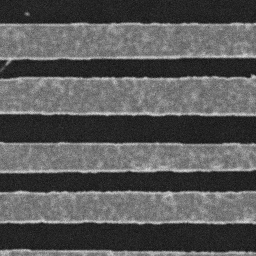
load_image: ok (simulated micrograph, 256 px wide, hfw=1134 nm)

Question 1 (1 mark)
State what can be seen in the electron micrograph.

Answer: lines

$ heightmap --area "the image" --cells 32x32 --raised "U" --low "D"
DDDDDDDDDDDDDDDDDDDDDDDDDDDDDDDD
DDDDDDDDDDDDDDDDDDDDDDDDDDDDDDDD
DDDDDDDDDDDDDDDDDDDDDDDDDDDDDDDD
UUUUUUUUUUUUUUUUUUUUUUUUUUUUUUUU
UUUUUUUUUUUUUUUUUUUUUUUUUUUUUUUU
UUUUUUUUUUUUUUUUUUUUUUUUUUUUUUUU
UUUUUUUUUUUUUUUUUUUUUUUUUUUUUUUU
DDDDDDDDDDDDDDDDDDDDDDDDDDDDDDDD
DDDDDDDDDDDDDDDDDDDDDDDDDDDDDDDD
DDDDDDDDDDDDDDDDDDDDDDDDDDDDDDDD
UUUUUUUUUUUUUUUUUUUUUUUUUUUUUUUU
UUUUUUUUUUUUUUUUUUUUUUUUUUUUUUUU
UUUUUUUUUUUUUUUUUUUUUUUUUUUUUUUU
UUUUUUUUUUUUUUUUUUUUUUUUUUUUUUUU
DDDDDDDDDDDDDDDDDDDDDDDDDDDDDDDD
DDDDDDDDDDDDDDDDDDDDDDDDDDDDDDDD
DDDDDDDDDDDDDDDDDDDDDDDDDDDDDDDD
DDDDDDDDDDDDDDDDDDDDDDDDDDDDDDDD
UUUUUUUUUUUUUUUUUUUUUUUUUUUUUUUU
UUUUUUUUUUUUUUUUUUUUUUUUUUUUUUUU
UUUUUUUUUUUUUUUUUUUUUUUUUUUUUUUU
UUUUUDDDDDDDDDDDDDDDDDDDDDDDDDDD
DDDDDDDDDDDDDDDDDDDDDDDDDDDDDDDD
DDDDDDDDDDDDDDDDDDDDDDDDDDDDDDDD
UUUUUUUUUUUUUUUUUUUUUUUUUUUUUUUU
UUUUUUUUUUUUUUUUUUUUUUUUUUUUUUUU
UUUUUUUUUUUUUUUUUUUUUUUUUUUUUUUU
UUUUUUUUUUUUUUUUUUUUUUUUUUUUUUUU
DDDDDDDDDDDDDDDDDDDDDDDDDDDDDDDD
DDDDDDDDDDDDDDDDDDDDDDDDDDDDDDDD
DDDDDDDDDDDDDDDDDDDDDDDDDDDDDDDD
UUUUUUUUUUUUUUDDDDDDDDDDDDDDDDDD